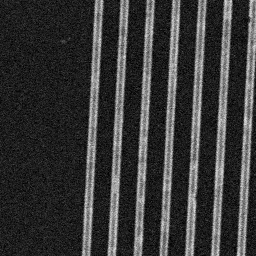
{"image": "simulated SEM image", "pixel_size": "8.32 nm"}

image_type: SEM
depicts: parallel lines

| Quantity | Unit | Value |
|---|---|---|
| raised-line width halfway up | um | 0.0457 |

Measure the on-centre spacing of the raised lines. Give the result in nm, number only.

214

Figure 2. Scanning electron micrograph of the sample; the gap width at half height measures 0.167 µm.